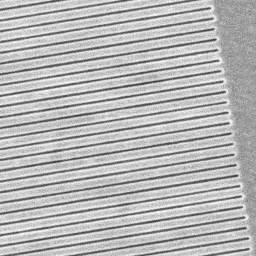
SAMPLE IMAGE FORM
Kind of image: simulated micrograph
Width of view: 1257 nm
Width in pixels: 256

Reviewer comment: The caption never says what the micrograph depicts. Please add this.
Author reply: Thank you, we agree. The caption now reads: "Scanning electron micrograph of parallel lines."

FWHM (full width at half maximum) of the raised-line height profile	0.0382	microns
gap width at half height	14.5	nanometers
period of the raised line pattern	0.0522	µm